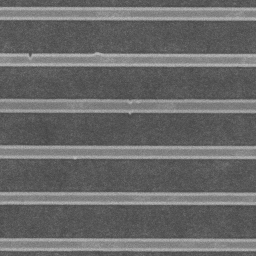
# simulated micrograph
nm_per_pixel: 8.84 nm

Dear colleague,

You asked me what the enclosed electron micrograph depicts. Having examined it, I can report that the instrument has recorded parallel lines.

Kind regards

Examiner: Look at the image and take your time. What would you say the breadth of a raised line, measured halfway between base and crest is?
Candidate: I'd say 94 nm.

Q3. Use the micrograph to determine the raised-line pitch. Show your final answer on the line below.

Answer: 46.2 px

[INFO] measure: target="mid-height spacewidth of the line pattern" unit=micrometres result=0.312